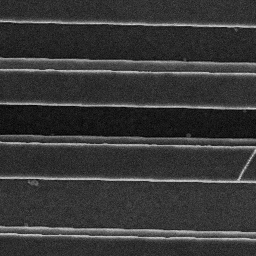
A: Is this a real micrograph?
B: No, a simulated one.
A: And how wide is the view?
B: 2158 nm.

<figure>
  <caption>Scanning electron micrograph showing lines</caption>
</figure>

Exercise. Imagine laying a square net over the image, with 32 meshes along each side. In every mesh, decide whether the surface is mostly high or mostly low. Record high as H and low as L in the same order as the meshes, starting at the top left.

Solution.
HHHHHHHHHHHHHHHHHHHHHHHHHHHHHHHH
HHHHHHHHHHHHHHHHHHHHHHHHHHHHHHHH
HHHHHHHHHHHHHHHHHHHHHHHHHHHHHHHH
LLLLLLLLLLLLLLLLLLLLLLLLLLLLLLLL
LLLLLLLLLLLLLLLLLLLLLLLLLLLLLLLL
LLLLLLLLLLLLLLLLLLLLLLLLLLLLLLLL
LLLLLLLLLLLLLLLLLLLLLLLLLLLLLLLL
HHHHHHHHHHLLLLLLLLLLLLLLLLLLLLLL
HHHHHHHHHHHHHHHHHHHHHHHHHHHHHHHH
HHHHHHHHHHHHHHHHHHHHHHHHHHHHHHHH
HHHHHHHHHHHHHHHHHHHHHHHHHHHHHHHH
HHHHHHHHHHHHHHHHHHHHHHHHHHHHHHHH
HHHHHHHHHHHHHHHHHHHHHHHHHHHHHHHH
LLLLLLLLLLLLLLLLLLLLLLLLHHHHHHHH
LLLLLLLLLLLLLLLLLLLLLLLLLLLLLLLL
LLLLLLLLLLLLLLLLLLLLLLLLLLLLLLLL
LLLLLLLLLLLLLLLLLLLLLLLLLLLLLLLL
HHHHHHHHHHHHHHHHHHHHHHHHHHHHHHHH
HHHHHHHHHHHHHHHHHHHHHHHHHHHHHHHH
HHHHHHHHHHHHHHHHHHHHHHHHHHHHHHHH
HHHHHHHHHHHHHHHHHHHHHHHHHHHHHHHH
HHHHHHHHHHHHHHHHHHHHHHHHHHHHHHHH
LLLLLLLLLLLLLLHHHHHHHHHHHHHHHHHH
LLLLLLLLLLLLLLLLLLLLLLLLLLLLLLLL
LLLLLLLLLLLLLLLLLLLLLLLLLLLLLLLL
LLLLLLLLLLLLLLLLLLLLLLLLLLLLLLLL
LLLLLLLLLLLLLLLLLLLLLLLLLLLLLLLL
LLLLLLLLLLLLLLLLLLLLLLLLLLLLLLLL
HHHHLLLLLLLLLLLLLLLLLLLLLLLLLLLL
HHHHHHHHHHHHHHHHHHHHHHHHHHHHHHHH
HHHHHHHHHHHHHHHHHHHHHHHHHHHHHHHH
HHHHHHHHHHHHHHHHHHHHHHHHHHHHHHHH